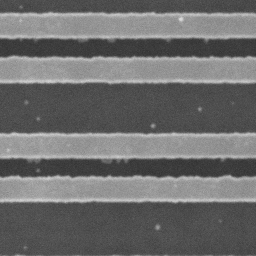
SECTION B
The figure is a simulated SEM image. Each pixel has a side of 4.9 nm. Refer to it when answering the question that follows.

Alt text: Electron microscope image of lines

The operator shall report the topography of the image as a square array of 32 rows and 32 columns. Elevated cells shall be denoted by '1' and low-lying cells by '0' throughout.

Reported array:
00000000000000000000000000000000
00000000000000000000000000000000
11111111111111111111111111111111
11111111111111111111111111111111
11111111111111111111111111111111
00000000000000000000000000000000
00000000000000000000000000000000
11111111111111111111111111111111
11111111111111111111111111111111
11111111111111111111111111111111
00000000000000000000000000000000
00000000000000000000000000000000
00000000000000000000000000000000
00000000000000000000000000000000
00000000000000000000000000000000
00000000000000000000000000000000
00000000000000000000000000000000
11111111111111111111111111111111
11111111111111111111111111111111
11111111111111111111111111111111
00000000000000000000000000000000
00000000000000000000000000000000
11111111111111111111111111111111
11111111111111111111111111111111
11111111111111111111111111111111
00000000000000000000000000000000
00000000000000000000000000000000
00000000000000000000000000000000
00000000000000000000000000000000
00000000000000000000000000000000
00000000000000000000000000000000
00000000000000000000000000000000